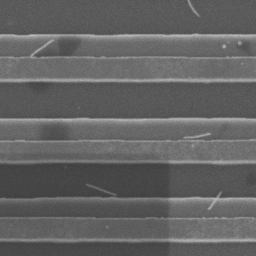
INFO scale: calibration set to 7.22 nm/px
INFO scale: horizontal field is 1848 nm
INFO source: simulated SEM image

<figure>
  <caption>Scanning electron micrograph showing lines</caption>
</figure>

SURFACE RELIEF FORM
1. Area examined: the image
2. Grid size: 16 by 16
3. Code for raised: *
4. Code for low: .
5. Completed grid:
................
................
****************
****************
****************
................
................
****************
****************
****************
................
................
****************
****************
****************
................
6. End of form